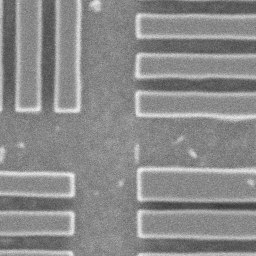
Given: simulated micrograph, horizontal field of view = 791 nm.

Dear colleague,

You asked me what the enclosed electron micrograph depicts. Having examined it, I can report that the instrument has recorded groups of lines, slits or small figures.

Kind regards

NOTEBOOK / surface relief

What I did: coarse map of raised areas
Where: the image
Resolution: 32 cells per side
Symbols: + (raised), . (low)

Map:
..+++..+++......................
..+++..+++......................
..+++..+++.......+++++++++++++++
..+++..+++.......+++++++++++++++
..+++..+++.......+++++++++++++++
..+++..+++......................
..+++..+++......................
..+++..+++.......+++++++++++++++
..+++..+++.......+++++++++++++++
..+++..+++.......+++++++++++++++
..+++..+++......................
..+++..+++.......++.............
..+++..+++.......+++++++++++++++
..+++..+++.......+++++++++++++++
..........................++++++
................................
................................
................................
................................
................................
................................
.................+++++++++++++++
+++++++++........+++++++++++++++
+++++++++........+++++++++++++++
.................+++++++++++++++
................................
++++.............+++++++++++++++
+++++++++........+++++++++++++++
+++++++++........+++++++++++++++
..................++++++++++++++
................................
+++++++++.......................